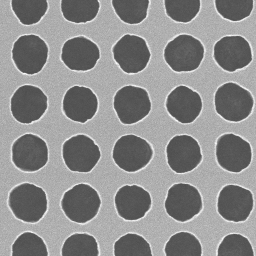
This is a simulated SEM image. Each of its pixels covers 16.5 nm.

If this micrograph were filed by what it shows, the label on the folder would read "a regular array of holes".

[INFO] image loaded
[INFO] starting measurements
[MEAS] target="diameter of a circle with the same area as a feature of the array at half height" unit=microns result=0.611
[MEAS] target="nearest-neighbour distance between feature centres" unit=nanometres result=815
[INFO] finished